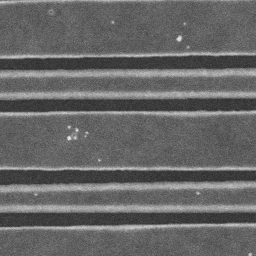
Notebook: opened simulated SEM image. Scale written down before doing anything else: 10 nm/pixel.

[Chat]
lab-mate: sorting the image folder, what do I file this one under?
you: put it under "lines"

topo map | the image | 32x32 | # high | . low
################################
################################
################################
################################
################################
################################
################################
................................
................................
################################
################################
################################
................................
................................
################################
################################
################################
################################
################################
################################
################################
................................
................................
################################
################################
################################
................................
................................
################################
################################
################################
################################